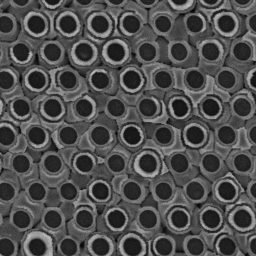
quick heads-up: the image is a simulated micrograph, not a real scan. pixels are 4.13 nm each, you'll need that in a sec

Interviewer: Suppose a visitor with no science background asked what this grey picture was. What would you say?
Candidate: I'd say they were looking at a regular array of holes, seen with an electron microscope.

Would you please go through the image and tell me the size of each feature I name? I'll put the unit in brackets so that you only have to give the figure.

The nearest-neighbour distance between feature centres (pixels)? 31.2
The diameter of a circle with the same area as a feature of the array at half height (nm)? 73.3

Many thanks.